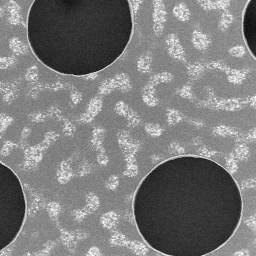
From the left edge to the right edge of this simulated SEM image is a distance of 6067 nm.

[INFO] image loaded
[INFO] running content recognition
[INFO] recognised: holes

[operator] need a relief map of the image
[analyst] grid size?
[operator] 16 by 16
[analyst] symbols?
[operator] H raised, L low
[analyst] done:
HHLLLLLLHHHHHHHL
HHLLLLLLHHHHHHHL
HHLLLLLLHHHHHHHL
HHLLLLLHHHHHHHHH
HHHHLLHHHHHHHHHH
HHHHHHHHHHHHHHHH
HHHHHHHHHHHHHHHH
HHHHHHHHHHHHHHHH
HHHHHHHHHHHHHHHH
HHHHHHHHHHHHHHHH
HHHHHHHHHHLLLLHH
LHHHHHHHHLLLLLLH
LLHHHHHHLLLLLLLH
LLHHHHHHLLLLLLLH
LHHHHHHHHLLLLLLH
HHHHHHHHHHLLLLHH